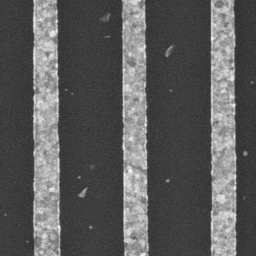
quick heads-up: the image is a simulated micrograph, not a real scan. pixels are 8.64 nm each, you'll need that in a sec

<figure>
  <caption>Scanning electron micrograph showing lines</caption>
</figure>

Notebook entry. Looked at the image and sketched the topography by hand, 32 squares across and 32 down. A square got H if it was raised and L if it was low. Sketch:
LLLLHHHLLLLLLLLHHHLLLLLLLLHHHLLL
LLLLHHHLLLLLLLLHHHLLLLLLLLHHHLLL
LLLLHHHLLLLLLLLHHHLLLLLLLLHHHLLL
LLLLHHHLLLLLLLLHHHLLLLLLLLHHHLLL
LLLLHHHLLLLLLLLHHHLLLLLLLLHHHLLL
LLLLHHHLLLLLLLLHHHLLLLLLLLHHHLLL
LLLLHHHLLLLLLLLHHHLLLLLLLLHHHLLL
LLLLHHHLLLLLLLLHHHLLLLLLLLHHHLLL
LLLLHHHLLLLLLLLHHHLLLLLLLLHHHLLL
LLLLHHHLLLLLLLLHHHLLLLLLLLHHHLLL
LLLLHHHLLLLLLLLHHHLLLLLLLLHHHLLL
LLLLHHHLLLLLLLLHHHLLLLLLLLHHHLLL
LLLLHHHLLLLLLLLLHHLLLLLLLLHHHLLL
LLLLHHHLLLLLLLLHHHLLLLLLLLHHHLLL
LLLLHHHLLLLLLLLHHHLLLLLLLLHHHLLL
LLLLHHHLLLLLLLLLHHLLLLLLLLHHHLLL
LLLLHHHLLLLLLLLHHHLLLLLLLLLHHLLL
LLLLHHHLLLLLLLLHHHLLLLLLLLHHHLLL
LLLLHHHLLLLLLLLHHHLLLLLLLLHHHLLL
LLLLHHHLLLLLLLLLHHLLLLLLLLHHHLLL
LLLLHHHLLLLLLLLLHHLLLLLLLLLHHLLL
LLLLHHHLLLLLLLLLHHLLLLLLLLHHHLLL
LLLLHHHLLLLLLLLLHHLLLLLLLLLHHLLL
LLLLHHHLLLLLLLLLHHLLLLLLLLLHHLLL
LLLLHHHLLLLLLLLLHHLLLLLLLLLHHLLL
LLLLHHHLLLLLLLLLHHLLLLLLLLLHHLLL
LLLLHHHLLLLLLLLLHHLLLLLLLLHHHLLL
LLLLHHHLLLLLLLLLHHLLLLLLLLHHHLLL
LLLLHHHLLLLLLLLLHHLLLLLLLLHHHLLL
LLLLHHHLLLLLLLLLHHLLLLLLLLHHHLLL
LLLLHHHLLLLLLLLLHHLLLLLLLLHHHLLL
LLLLHHHLLLLLLLLLHHLLLLLLLLHHHLLL